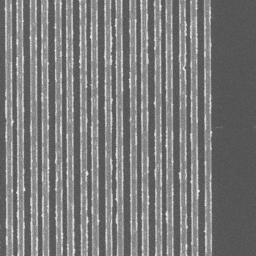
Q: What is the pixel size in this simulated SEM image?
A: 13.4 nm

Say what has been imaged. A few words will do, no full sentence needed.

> parallel lines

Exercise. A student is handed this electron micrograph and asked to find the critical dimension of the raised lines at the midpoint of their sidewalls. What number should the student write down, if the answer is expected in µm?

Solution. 0.0924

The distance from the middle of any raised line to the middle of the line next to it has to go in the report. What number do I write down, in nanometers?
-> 167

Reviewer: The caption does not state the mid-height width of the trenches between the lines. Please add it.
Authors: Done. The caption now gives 77.3 nm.